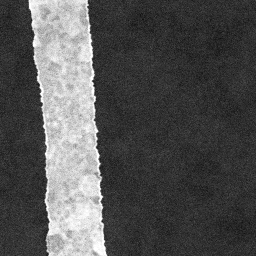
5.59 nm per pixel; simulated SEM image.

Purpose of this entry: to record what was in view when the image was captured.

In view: one or a few lines or trenches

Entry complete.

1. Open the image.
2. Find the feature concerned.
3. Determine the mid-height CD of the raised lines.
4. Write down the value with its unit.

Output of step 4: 53.1 px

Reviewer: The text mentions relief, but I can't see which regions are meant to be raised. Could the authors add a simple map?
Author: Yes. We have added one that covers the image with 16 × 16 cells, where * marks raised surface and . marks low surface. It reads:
..***...........
..****..........
..****..........
..****..........
..****..........
...***..........
...***..........
...***..........
...***..........
...***..........
...***..........
...***..........
...***..........
...***..........
...***..........
...****.........